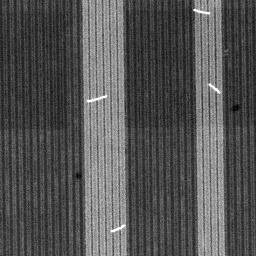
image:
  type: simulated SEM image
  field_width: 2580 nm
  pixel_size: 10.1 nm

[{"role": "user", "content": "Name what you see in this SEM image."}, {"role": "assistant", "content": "parallel lines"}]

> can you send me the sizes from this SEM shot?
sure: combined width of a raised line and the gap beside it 0.0707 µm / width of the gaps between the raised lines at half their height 20.2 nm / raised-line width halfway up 0.0491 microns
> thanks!